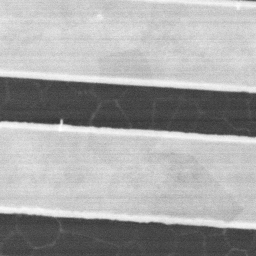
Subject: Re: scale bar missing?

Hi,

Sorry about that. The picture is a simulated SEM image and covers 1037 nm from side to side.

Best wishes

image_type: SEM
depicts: one or a few lines or trenches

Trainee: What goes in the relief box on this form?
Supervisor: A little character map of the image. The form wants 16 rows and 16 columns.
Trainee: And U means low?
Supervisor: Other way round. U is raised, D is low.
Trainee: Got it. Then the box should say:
UUUUUUUUUUUUUUUU
UUUUUUUUUUUUUUUU
UUUUUUUUUUUUUUUU
UUUUUUUUUUUUUUUU
UUUUUUUUUUUUUUUU
DDDDDDDDDDDDDDUU
DDDDDDDDDDDDDDDD
DDDDDDDDDDDDDDDD
UUUUUUUUUUUUDDDD
UUUUUUUUUUUUUUUU
UUUUUUUUUUUUUUUU
UUUUUUUUUUUUUUUU
UUUUUUUUUUUUUUUU
DDDDDUUUUUUUUUUU
DDDDDDDDDDDDDDDD
DDDDDDDDDDDDDDDD